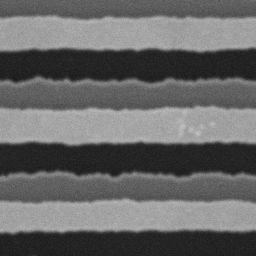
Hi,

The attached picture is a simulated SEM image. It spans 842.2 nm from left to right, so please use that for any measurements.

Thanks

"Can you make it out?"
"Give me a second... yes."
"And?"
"lines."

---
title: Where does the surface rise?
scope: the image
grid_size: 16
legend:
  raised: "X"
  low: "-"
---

XXXXXXXXXXXXXXXX
XXXXXXXXXXXXXXXX
XXXXXXXXXXXXXXXX
----------------
----------------
XXXXXXXXXXXXXXXX
XXXXXXXXXXXXXXXX
XXXXXXXXXXXXXXXX
XXXXXXXXXXXXXXXX
----------------
----------------
XXXXXXXXXXXXXXXX
XXXXXXXXXXXXXXXX
XXXXXXXXXXXXXXXX
X---------------
----------------